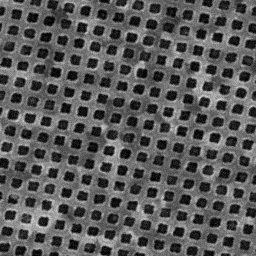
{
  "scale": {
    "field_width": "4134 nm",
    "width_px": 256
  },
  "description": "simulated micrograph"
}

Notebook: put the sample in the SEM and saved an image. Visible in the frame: a regular array of holes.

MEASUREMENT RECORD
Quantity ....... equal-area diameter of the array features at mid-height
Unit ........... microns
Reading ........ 0.189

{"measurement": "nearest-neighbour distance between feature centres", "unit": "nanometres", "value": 263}